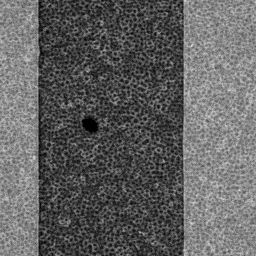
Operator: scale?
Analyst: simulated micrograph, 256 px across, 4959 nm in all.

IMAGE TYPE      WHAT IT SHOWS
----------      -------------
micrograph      one or a few lines or trenches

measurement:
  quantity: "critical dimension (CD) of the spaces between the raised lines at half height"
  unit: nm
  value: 2830